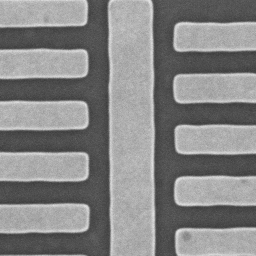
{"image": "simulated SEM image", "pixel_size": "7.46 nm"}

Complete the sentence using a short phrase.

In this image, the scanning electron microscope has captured groups of lines, slits or small figures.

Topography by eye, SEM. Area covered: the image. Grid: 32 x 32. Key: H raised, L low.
HHHHHHHHHHHLLLHHHHHLLLLLLLLLLLLL
HHHHHHHHHHHLLLHHHHHLLLLLLLLLLLLL
HHHHHHHHHHHLLLHHHHHLLLLLLLLLLLLL
LLLLLLLLLLLLLLHHHHHLLLHHHHHHHHHH
LLLLLLLLLLLLLLHHHHHLLLHHHHHHHHHH
LLLLLLLLLLLLLLHHHHHLLLHHHHHHHHHH
HHHHHHHHHHHLLLHHHHHLLLLLLLLLLLLL
HHHHHHHHHHHLLLHHHHHLLLLLLLLLLLLL
HHHHHHHHHHHLLLHHHHHLLLLLLLLLLLLL
HHHHHHHHHHLLLLHHHHHLLLHHHHHHHHHH
LLLLLLLLLLLLLLHHHHHLLLHHHHHHHHHH
LLLLLLLLLLLLLLHHHHHLLLHHHHHHHHHH
LLLLLLLLLLLLLLHHHHHLLLHHHHHHHHHH
HHHHHHHHHHHLLLHHHHHLLLLLLLLLLLLL
HHHHHHHHHHHLLLHHHHHLLLLLLLLLLLLL
HHHHHHHHHHHLLLHHHHHLLLLLLLLLLLLL
LLLLLLLLLLLLLLHHHHHLLLHHHHHHHHHH
LLLLLLLLLLLLLLHHHHHLLLHHHHHHHHHH
LLLLLLLLLLLLLLHHHHHLLLHHHHHHHHHH
HHHHHHHHHHHLLLHHHHHLLLLLLLLLLLLL
HHHHHHHHHHHLLLHHHHHLLLLLLLLLLLLL
HHHHHHHHHHHLLLHHHHHLLLLLLLLLLLLL
LHHHHHHHHHLLLLHHHHHLLLHHHHHHHHHH
LLLLLLLLLLLLLLHHHHHLLLHHHHHHHHHH
LLLLLLLLLLLLLLHHHHHLLLHHHHHHHHHH
LLLLLLLLLLLLLLHHHHHLLLHHHHHLHHHH
HHHHHHHHHHHLLLHHHHHLLLLLLLLLLLLL
HHHHHHHHHHHLLLHHHHHLLLLLLLLLLLLL
HHHHHHHHHHHLLLHHHHHLLLLLLLLLLLLL
LLLLLLLLLLLLLLHHHHHLLLHHHHHHHHHH
LLLLLLLLLLLLLLHHHHHLLLHHHHHHHHHH
LLLLLLLLLLLLLLHHHHHLLLHHHHHHHHHH